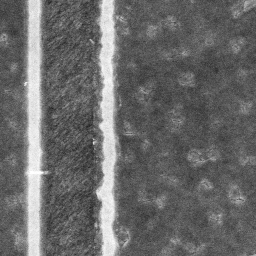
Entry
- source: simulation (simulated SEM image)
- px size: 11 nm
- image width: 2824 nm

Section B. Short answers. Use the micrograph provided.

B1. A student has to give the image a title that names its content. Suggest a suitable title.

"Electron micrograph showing one or a few lines or trenches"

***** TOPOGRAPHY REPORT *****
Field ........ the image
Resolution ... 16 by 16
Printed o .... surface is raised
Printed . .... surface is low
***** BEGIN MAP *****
oo.....ooooooooo
oo.....ooooooooo
oo.....ooooooooo
oo.....ooooooooo
oo.....ooooooooo
oo.....ooooooooo
oo.....ooooooooo
oo.....ooooooooo
oo.....ooooooooo
oo.....ooooooooo
oo.....ooooooooo
oo.....ooooooooo
oo.....ooooooooo
oo.....ooooooooo
oo.....ooooooooo
oo.....ooooooooo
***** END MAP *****